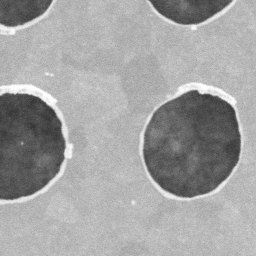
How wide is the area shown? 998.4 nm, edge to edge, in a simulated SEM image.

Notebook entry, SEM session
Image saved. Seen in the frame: holes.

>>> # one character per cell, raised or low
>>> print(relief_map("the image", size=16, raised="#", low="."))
...#######....##
..#########.####
################
################
################
################
...#######....##
....#####......#
....#####......#
....#####......#
....#####......#
...#######....##
.###############
################
################
################